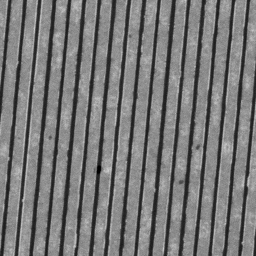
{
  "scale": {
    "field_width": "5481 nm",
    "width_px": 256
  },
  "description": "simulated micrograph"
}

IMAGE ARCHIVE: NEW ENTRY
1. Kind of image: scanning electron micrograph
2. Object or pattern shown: parallel lines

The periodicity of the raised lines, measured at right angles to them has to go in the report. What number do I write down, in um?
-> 0.318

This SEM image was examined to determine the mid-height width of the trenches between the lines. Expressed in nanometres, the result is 101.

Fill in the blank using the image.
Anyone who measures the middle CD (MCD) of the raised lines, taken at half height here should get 226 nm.